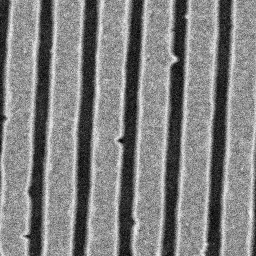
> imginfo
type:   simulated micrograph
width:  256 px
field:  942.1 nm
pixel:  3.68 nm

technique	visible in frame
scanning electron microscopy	parallel lines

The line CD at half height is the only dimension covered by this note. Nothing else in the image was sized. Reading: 107 nm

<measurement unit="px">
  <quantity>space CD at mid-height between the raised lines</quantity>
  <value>15.4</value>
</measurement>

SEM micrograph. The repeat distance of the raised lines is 0.164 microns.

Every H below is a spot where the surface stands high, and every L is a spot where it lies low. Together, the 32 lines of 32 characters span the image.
LHHHHLLHHHLLHHHHLLHHHHLLHHHLLHHH
LHHHHLLHHHLLHHHHLLHHHHLLHHHLLHHH
LHHHHLLHHHLLHHHHLLHHHHLHHHHLLHHH
LHHHHLLHHHLLHHHHLLHHHLLHHHHLLHHH
LHHHHLLHHHLLHHHHLLHHHLLHHHHLLHHH
LHHHHLLHHHLLHHHHLLHHHLLHHHHLLHHH
LHHHHLLHHHLLHHHHLLHHHLLHHHHLLHHH
LHHHLLLHHHLLHHHHLLHHHHLHHHHLLHHH
LHHHHLHHHHLLHHHHLLHHHLLHHHHLLHHH
LHHHLLHHHHLLHHHHLLHHHLLHHHHLLHHH
LHHHLLHHHHLLHHHHLLHHHLLHHHHLLHHH
LHHHLLHHHHLLHHHLLHHHHLLHHHHLLHHH
LHHHLLHHHHLLHHHLLHHHHLLHHHHLLHHH
LHHHLLHHHHLLHHHLLHHHHLLHHHHLHHHH
LHHHLLHHHHLLHHHLLHHHHLLHHHHLHHHH
LHHHLLHHHHLLHHHLLHHHHLLHHHLLHHHH
HHHHLLHHHHLLHHHLLHHHHLLHHHLLHHHH
HHHHLLHHHHLLHHHLLHHHHLLHHHLLHHHH
HHHHLLHHHHLLHHHLLHHHHLLHHHLLHHHH
HHHHLLHHHHLLHHHLLHHHHLLHHHLLHHHH
HHHHLLHHHLLLHHHLLHHHHLLHHHLLHHHH
HHHHLLHHHLLHHHHLLHHHHLLHHHLLHHHH
HHHHLLHHHLLLHHHLLHHHLLHHHHLLHHHH
HHHHLLHHHLLHHHHLLHHHHLHHHHLLHHHH
HHHHLLHHHLLHHHHLLHHHLLHHHHLLHHHH
HHHHLLHHHLLHHHHLLHHHLLHHHHLLHHHH
HHHHLLHHHLLHHHHLLHHHLLHHHHLLHHHH
HHHHLLHHHLLHHHHLLHHHLLHHHHLLHHHH
HHHHLLHHHLLHHHHLLHHHLLHHHHLLHHHH
HHHLLLHHHLLHHHHLLHHHLLHHHHLLHHHL
HHHLLHHHHLLHHHHLLHHHLLHHHHLLHHHL
HHHLLHHHHLLHHHHLLHHHLLHHHHLLHHHL